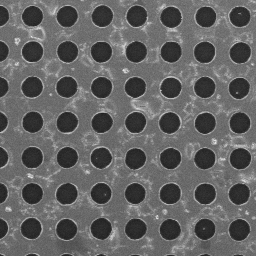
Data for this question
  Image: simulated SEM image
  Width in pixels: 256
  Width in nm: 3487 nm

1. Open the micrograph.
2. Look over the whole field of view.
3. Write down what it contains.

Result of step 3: a regular array of holes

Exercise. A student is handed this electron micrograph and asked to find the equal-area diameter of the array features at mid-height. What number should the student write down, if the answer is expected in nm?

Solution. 294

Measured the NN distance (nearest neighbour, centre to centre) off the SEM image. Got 468 nm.